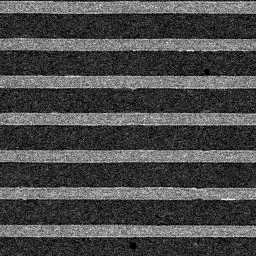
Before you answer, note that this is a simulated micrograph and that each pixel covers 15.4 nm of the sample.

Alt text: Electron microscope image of parallel lines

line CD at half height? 177 nm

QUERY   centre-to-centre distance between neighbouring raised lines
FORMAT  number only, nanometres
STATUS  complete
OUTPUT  572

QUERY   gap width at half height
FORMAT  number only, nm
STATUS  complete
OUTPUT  402